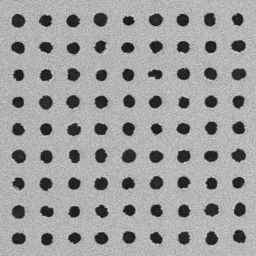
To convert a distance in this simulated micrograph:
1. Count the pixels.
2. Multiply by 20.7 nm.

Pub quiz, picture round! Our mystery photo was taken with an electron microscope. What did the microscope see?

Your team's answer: a regular array of holes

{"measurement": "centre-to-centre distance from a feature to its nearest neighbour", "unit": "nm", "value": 555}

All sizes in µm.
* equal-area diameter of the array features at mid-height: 0.261